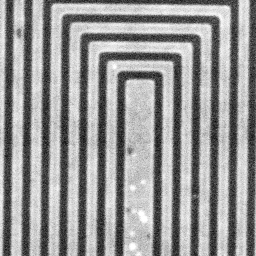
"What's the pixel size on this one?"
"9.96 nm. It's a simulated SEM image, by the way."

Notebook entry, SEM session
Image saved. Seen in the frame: groups of lines, slits or small figures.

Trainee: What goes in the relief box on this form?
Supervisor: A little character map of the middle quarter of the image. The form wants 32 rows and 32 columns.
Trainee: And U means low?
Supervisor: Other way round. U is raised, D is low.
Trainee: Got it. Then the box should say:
DDUUDDUUDDDUUUUUUUUUUUUUUUUDDDUU
DDUUDDUUDDDUUUUUUUUUUUUUUUUDDDUU
DDUUDDUUDDDUUDDDDDDDDDDDDUUDDDUU
DDUUDDUUDDDUUDDDDDDDDDDDDUUDDDUU
DDUUDDUUDDDUUDDDUUUUUUDDDUUDDDUU
DDUDDDUUDDDUUDDDUUUUUUDDDUUDDDUU
DDUDDDUUDDDUUDDDUUUUUUDDDUUDDDUU
DDUDDDUUDDDUUDDDUUUUUUDDDUUDDDUU
DDUDDDUUDDDUUDDDUUUUUUDDDUUDDDUU
DDUDDDUUDDDUUDDDUUUUUUDDDUUDDDUU
DDUDDDUUDDDUUDDDUUUUUUDDDUUDDDUU
DDUDDDUUDDDUUDDDUUUUUUDDDUUDDDUU
DUUDDDUUDDDUUDDDUUUUUUDDDUUDDDUU
DUUDDDUUDDDUUDDDUUUUUUDDDUUDDDUU
DUUDDDUUDDDUUDDDUUUUUUDDDUUDDDUU
DUUDDDUUDDDUUDDDUUUUUUDDDUUDDDUU
DUUDDDUUDDDUUDDDUUUUUUDDDUUDDDUU
DUUDDDUUDDDUUDDDUUUUUUDDDUUDDDUU
DUUDDDUUDDDUUDDDUUUUUUDDDUUDDDUU
DUUDDDUUDDDUUDDDUUUUUUDDDUUDDDUU
DUUDDDUUDDDUUDDDUUUUUUDDDUUDDDUU
DUUDDDUUDDDUUDDDUUUUUUDDDUUDDDUU
DUUDDDUUDDDUUDDUUUUUUUDDDUUDDDUU
DUUDDDUUDDDUUDDUUUUUUUDDDUUDDDUU
DUUDDDUUDDDUUDDUUUUUUUDDDUUDDDUU
DUUDDDUUDDDUUDDUUUUUUUDDDUUDDDUU
DUUDDDUUDDDUUDDUUUUUUUDDDUUDDDUD
DUUDDDUUDDDUUDDUUUUUUUDDDUUDDDUD
DUUDDDUUDDDUUDDUUUUUUUDDDUUDDDUD
DUUDDDUUDDDUUDDUUUUUUUDDDUUDDDUD
DUUDDDUUDDDUUDDUUUUUUUDDDUUDDDUD
DUUDDDUUDDDUUDDUUUUUUUDDDUUDDDUD